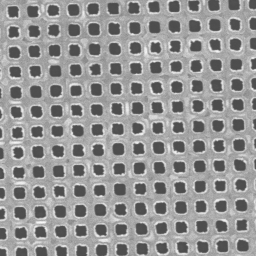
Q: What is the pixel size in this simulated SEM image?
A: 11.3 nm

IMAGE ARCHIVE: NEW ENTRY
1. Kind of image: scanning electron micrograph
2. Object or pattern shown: a regular array of holes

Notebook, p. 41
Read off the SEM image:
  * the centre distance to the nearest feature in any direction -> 19.6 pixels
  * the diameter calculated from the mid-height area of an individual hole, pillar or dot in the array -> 139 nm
